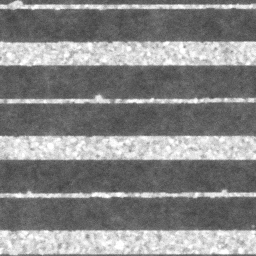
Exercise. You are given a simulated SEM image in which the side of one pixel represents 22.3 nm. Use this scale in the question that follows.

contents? lines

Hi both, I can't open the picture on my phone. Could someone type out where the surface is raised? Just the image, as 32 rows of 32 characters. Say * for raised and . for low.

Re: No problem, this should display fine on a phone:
..*.............................
................................
................................
................................
................................
********************************
********************************
********************************
................................
................................
................................
................................
................................
................................
................................
................................
................................
********************************
********************************
********************************
................................
................................
................................
................................
................................
................................
................................
................................
................................
********************************
********************************
********************************